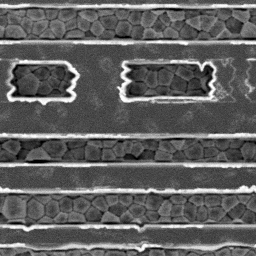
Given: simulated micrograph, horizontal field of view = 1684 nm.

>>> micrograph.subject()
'one or a few lines or trenches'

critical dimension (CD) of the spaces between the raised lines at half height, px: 32.8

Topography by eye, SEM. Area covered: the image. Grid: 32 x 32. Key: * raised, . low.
********************************
................................
................................
................................
................................
********************************
********************************
********************************
**.......*******...........*****
*........*******...........*****
*........*******..........******
**.......*******..........******
********************************
********************************
********************************
********************************
********************************
................................
................................
................................
**********.*********************
********************************
********************************
********************************
................................
................................
................................
................................
********************************
********************************
********************************
................................